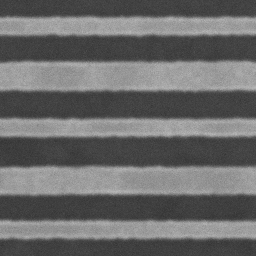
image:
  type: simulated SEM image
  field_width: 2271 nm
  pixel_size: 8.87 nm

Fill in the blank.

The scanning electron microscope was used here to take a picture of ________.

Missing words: lines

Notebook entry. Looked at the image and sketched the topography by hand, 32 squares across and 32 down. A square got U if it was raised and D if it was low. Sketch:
DDDDDDDDDDDDDDDDDDDDDDDDDDDDDDDD
DDDDDDDDDDDDDDDDDDDDDDDDDDDDDDDD
UUUUUUUUUUUUUUUUUUUUUUUUUUUUUUUU
UUUUUUUUUUUUUUUUUUUUUUUUUUUUUUUU
DDDDDDDDDDDDDDDDDDDDDDDDDDDDDDDD
DDDDDDDDDDDDDDDDDDDDDDDDDDDDDDDD
DDDDDDDDDDDDDDDDDDDDDDDDDDDDDDDD
DDDDDDDDDDDDDDDDDDDDDDDDDDDDDDDD
UUUUUUUUUUUUUUUUUUUUUUUUUUUUUUUU
UUUUUUUUUUUUUUUUUUUUUUUUUUUUUUUU
UUUUUUUUUUUUUUUUUUUUUUUUUUUUUUUU
DDDDDDDDDDDDDDDDDDDDDDDDDDDDDDDD
DDDDDDDDDDDDDDDDDDDDDDDDDDDDDDDD
DDDDDDDDDDDDDDDDDDDDDDDDDDDDDDDD
DDDDDDDDDDDDDDDDDDDDDDDDDDDDDDDD
UUUUUUUUUUUUUUUUUUUUUUUUUUUUUUUU
UUUUUUUUUUUUUUUUUUUUUUUUUUUUUUUU
DDDDDDDDDDDDDDDDDDDDDDDDDDDDDDDD
DDDDDDDDDDDDDDDDDDDDDDDDDDDDDDDD
DDDDDDDDDDDDDDDDDDDDDDDDDDDDDDDD
DDDDDDDDDDDDDDDDDDDDDDDDDDDDDDDD
UUUUUUUUUUUUUUUUUUUUUUUUUUUUUUUU
UUUUUUUUUUUUUUUUUUUUUUUUUUUUUUUU
UUUUUUUUUUUUUUUUUUUUUUUUUUUUUUUU
DDDDDDDDDDDDDDDDDDDDDDDDDDDDDDDD
DDDDDDDDDDDDDDDDDDDDDDDDDDDDDDDD
DDDDDDDDDDDDDDDDDDDDDDDDDDDDDDDD
DDDDDDDDDDDDDDDDDDDDDDDDDDDDDDDD
UUUUUUUUUUUUUUUUUUUUUUUUUUUUUUUU
UUUUUUUUUUUUUUUUUUUUUUUUUUUUUUUU
DDDDDDDDDDDDDDDDDDDDDDDDDDDDDDDD
DDDDDDDDDDDDDDDDDDDDDDDDDDDDDDDD